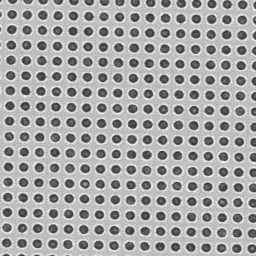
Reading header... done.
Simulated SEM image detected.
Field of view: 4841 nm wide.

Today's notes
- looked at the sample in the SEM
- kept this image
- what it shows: a regular array of holes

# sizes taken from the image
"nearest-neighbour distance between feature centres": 282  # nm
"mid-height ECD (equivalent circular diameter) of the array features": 9.9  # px